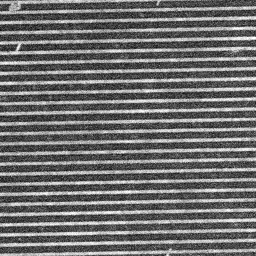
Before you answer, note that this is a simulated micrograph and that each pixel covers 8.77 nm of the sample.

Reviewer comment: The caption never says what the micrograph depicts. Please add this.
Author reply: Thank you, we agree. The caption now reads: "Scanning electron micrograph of parallel lines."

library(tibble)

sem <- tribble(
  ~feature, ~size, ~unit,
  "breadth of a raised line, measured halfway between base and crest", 13.1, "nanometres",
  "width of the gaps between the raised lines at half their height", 72.3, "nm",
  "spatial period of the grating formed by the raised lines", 88.6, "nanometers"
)